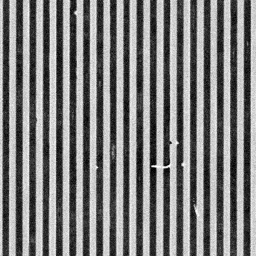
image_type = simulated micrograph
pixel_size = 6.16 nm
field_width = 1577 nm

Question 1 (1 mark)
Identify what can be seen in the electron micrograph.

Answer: parallel lines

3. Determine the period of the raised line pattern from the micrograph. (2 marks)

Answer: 82.5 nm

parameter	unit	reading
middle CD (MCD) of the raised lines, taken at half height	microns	0.04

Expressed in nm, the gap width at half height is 46.2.